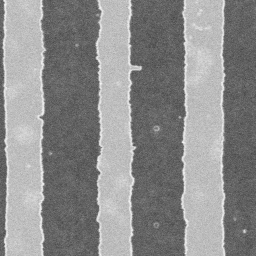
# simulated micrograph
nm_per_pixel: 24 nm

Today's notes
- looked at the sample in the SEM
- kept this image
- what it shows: one or a few lines or trenches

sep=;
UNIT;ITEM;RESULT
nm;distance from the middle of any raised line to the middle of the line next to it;2160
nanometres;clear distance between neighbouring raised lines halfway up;1340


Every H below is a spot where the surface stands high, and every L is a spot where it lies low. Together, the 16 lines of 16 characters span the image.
HHHLLLHHLLLLHHLL
HHHLLLHHLLLLHHLL
HHHLLLHHLLLLHHLL
HHHLLLHHLLLLHHLL
HHHLLLHHLLLLHHLL
HHHLLLHHLLLLHHLL
HHHLLLHHLLLLHHLL
HHHLLLHHLLLLHHLL
HHHLLLHHLLLHHHLL
HHHLLLHHLLLHHHLL
HHHLLLHHLLLHHHLL
HHHLLLHHLLLLHHLL
HHHLLLHHLLLHHHLL
HHHLLLHHLLLLHHLL
HHHLLLHHLLLLHHLL
HHHLLLHHLLLLHHLL